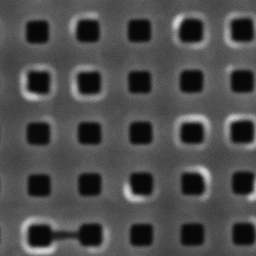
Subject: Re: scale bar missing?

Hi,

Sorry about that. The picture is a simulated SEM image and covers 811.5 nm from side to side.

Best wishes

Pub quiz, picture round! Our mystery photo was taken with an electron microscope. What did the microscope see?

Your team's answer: a regular array of holes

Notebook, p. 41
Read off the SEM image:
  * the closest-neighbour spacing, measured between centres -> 160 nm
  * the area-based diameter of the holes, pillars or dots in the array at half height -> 80.2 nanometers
